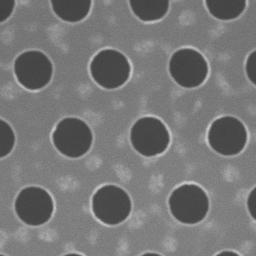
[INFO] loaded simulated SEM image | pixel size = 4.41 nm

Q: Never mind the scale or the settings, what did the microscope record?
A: a regular array of holes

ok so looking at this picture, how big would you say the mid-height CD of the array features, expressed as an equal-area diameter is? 0.175 microns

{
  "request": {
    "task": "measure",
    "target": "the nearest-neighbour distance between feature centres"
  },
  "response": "340 nm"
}